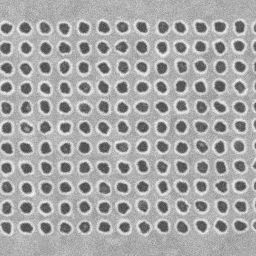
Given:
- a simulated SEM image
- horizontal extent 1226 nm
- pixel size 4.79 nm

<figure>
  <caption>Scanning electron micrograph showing a regular array of holes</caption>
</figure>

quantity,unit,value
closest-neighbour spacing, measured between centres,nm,90.7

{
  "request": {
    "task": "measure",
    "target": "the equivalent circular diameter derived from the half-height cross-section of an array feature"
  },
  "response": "0.0625 micrometres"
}